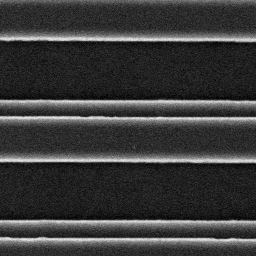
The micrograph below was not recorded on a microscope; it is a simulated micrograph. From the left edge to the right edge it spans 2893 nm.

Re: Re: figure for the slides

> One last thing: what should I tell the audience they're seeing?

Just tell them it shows lines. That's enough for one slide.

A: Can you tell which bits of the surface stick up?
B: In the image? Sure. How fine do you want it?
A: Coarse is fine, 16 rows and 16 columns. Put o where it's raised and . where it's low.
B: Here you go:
oooooooooooooooo
oooooooooooooooo
.......o..oooooo
................
................
................
oooooooooooooooo
oooooooooooooooo
oooooooooooooooo
oooooooooooooooo
................
................
................
................
oooooooooooooooo
oooooooooooooooo